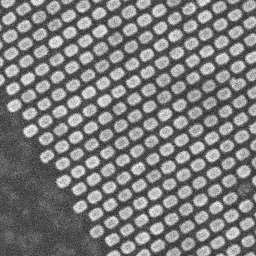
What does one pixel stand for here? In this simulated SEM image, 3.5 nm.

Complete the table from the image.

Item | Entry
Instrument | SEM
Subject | a regular array of raised bodies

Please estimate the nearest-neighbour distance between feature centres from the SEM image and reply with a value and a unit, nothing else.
59.9 nanometres